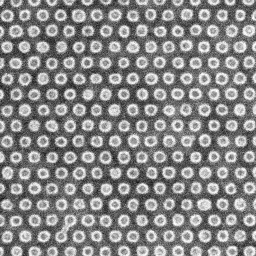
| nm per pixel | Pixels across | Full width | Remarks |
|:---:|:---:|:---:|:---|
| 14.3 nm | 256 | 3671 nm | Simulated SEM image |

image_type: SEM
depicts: a regular array of raised bodies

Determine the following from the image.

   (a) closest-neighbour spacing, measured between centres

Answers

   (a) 250 nanometres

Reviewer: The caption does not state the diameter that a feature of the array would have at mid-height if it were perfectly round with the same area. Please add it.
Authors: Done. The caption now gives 9.3 px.